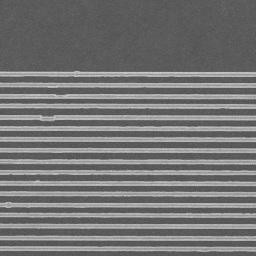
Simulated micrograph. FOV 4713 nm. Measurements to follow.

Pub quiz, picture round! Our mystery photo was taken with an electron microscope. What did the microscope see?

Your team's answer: parallel lines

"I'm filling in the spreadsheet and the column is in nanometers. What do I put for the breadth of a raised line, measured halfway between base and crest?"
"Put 66.7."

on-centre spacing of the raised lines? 201 nm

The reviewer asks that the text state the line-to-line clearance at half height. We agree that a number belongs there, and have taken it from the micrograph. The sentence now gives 140 nanometres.